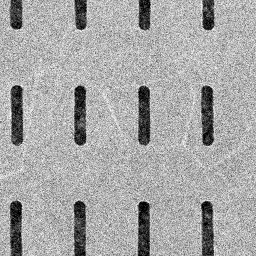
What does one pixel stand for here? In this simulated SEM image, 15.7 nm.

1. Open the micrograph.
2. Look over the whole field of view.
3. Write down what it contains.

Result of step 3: holes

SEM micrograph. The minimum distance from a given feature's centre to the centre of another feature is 994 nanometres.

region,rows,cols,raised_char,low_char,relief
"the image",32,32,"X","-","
X--XXXXXX--XXXXXX--XXXXXX--XXXXX
X--XXXXXX--XXXXXX--XXXXXX--XXXXX
X--XXXXXX--XXXXXX--XXXXXX--XXXXX
XX-XXXXXXX-XXXXXXX-XXXXXX-XXXXXX
XXXXXXXXXXXXXXXXXXXXXXXXXXXXXXXX
XXXXXXXXXXXXXXXXXXXXXXXXXXXXXXXX
XXXXXXXXXXXXXXXXXXXXXXXXXXXXXXXX
XXXXXXXXXXXXXXXXXXXXXXXXXXXXXXXX
XXXXXXXXXXXXXXXXXXXXXXXXXXXXXXXX
XXXXXXXXXXXXXXXXXXXXXXXXXXXXXXXX
XXXXXXXXXXXXXXXXXXXXXXXXXXXXXXXX
X--XXXXXX--XXXXXX--XXXXXX--XXXXX
X--XXXXXX--XXXXXX--XXXXXX--XXXXX
X--XXXXXX--XXXXXX--XXXXXX--XXXXX
X--XXXXXX--XXXXXX--XXXXXX--XXXXX
X--XXXXXX--XXXXXX--XXXXXX--XXXXX
X--XXXXXX--XXXXXX--XXXXXX--XXXXX
X--XXXXXX--XXXXXX--XXXXXX--XXXXX
XXXXXXXXXXXXXXXXXXXXXXXXXXXXXXXX
XXXXXXXXXXXXXXXXXXXXXXXXXXXXXXXX
XXXXXXXXXXXXXXXXXXXXXXXXXXXXXXXX
XXXXXXXXXXXXXXXXXXXXXXXXXXXXXXXX
XXXXXXXXXXXXXXXXXXXXXXXXXXXXXXXX
XXXXXXXXXXXXXXXXXXXXXXXXXXXXXXXX
XXXXXXXXXXXXXXXXXXXXXXXXXXXXXXXX
X--XXXXXX--XXXXXX--XXXXXX--XXXXX
X--XXXXXX--XXXXXX--XXXXXX--XXXXX
X--XXXXXX--XXXXXX--XXXXXX--XXXXX
X--XXXXXX--XXXXXX--XXXXXX--XXXXX
X--XXXXXX--XXXXXX--XXXXXX--XXXXX
X--XXXXXX--XXXXXX--XXXXXX--XXXXX
X--XXXXXX--XXXXXX--XXXXXX--XXXXX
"